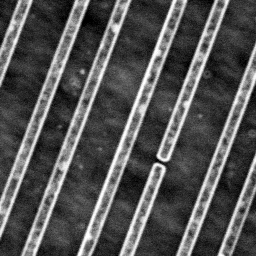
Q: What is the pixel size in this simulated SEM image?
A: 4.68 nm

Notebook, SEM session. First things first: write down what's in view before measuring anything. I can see parallel lines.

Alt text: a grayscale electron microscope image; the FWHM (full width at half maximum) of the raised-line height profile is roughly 0.0515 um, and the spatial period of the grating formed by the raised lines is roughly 0.214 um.